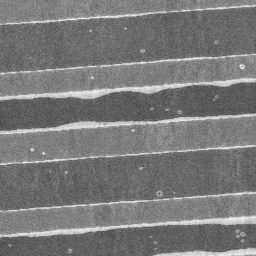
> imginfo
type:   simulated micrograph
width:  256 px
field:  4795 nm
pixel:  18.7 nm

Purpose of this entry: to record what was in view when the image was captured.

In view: lines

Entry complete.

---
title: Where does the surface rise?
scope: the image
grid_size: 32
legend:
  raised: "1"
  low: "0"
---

11111111111111111111111111111111
11111111111111111111000000000000
11111111000000000000000000000000
00000000000000000000000000000000
00000000000000000000000000000000
00000000000000000000000000000000
00000000000000000000000000000000
00000000000000000000000111111111
00000000001111111111111111111111
11111111111111111111111111111111
11111111111111111111111100000000
11111111111110000000000000000000
00000000000000000000000000000000
00000000000000000000000000000000
00000000000000000000000000000011
00000000000000111111111111111111
00111111111111111111111111111111
11111111111111111111111111111111
11111111111111111111111111100000
11111111111111000000000000000000
00000000000000000000000000000000
00000000000000000000000000000000
00000000000000000000000000000000
00000000000000000000000000000000
00000000000000000000000000011111
00000000000001111111111111111111
11111111111111111111111111111111
11111111111111111111111111111100
11111111111111000000000000000000
00000000000000000000000000000000
00000000000000000000000000000000
00000000000000000000000000000000